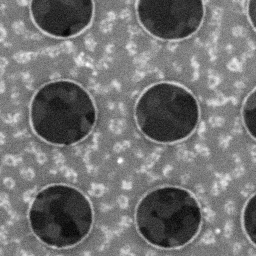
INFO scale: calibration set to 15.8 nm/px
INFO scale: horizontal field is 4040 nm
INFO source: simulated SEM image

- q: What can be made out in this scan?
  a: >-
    raised bodies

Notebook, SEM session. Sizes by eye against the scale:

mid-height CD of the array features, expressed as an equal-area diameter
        64.7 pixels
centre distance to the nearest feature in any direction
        1640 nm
